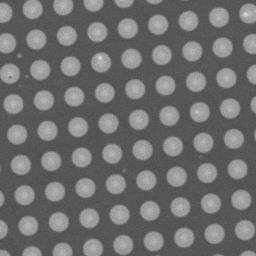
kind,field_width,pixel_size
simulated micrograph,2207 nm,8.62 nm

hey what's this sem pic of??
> an array of small figures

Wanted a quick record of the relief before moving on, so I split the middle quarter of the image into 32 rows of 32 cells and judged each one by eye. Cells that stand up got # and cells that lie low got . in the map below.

####...#####...####.............
####....###.....................
###.............................
........................###....#
................###....#####...#
.........###....####...#####...#
.###....####...#####...####.....
#####...#####...####....###.....
#####...####.....##.............
.####....##.....................
..#.............................
........................####....
...........#.....####...#####...
...#.....####...#####...#####...
.#####...#####..#####...####....
.#####...#####...####...........
.#####...####...................
..###...........................
..........................###...
..................###....####...
...........###...#####...#####..
...###....####...#####...####...
..#####...####...#####....###...
..#####...####....###...........
..#####....##...................
...###..........................
..........................####..
...................###....#####.
...........####...#####...#####.
...####....####...#####...####..
...#####...####....####....##...
...#####...####.....#...........